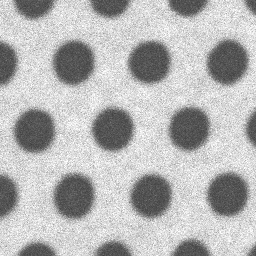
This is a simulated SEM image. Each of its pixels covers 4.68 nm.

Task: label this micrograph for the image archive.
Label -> a regular array of holes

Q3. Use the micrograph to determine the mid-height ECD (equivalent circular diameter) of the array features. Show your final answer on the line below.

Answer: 0.198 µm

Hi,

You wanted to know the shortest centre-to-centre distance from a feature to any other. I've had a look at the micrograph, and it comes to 358 nm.